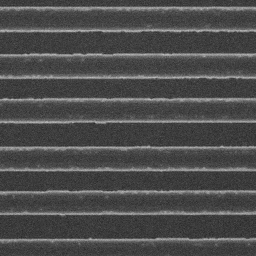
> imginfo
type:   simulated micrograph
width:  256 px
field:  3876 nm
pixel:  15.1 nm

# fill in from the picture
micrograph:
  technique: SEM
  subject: lines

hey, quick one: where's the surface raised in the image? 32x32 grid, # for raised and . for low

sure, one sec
................................
################################
################################
################################
................................
................................
................................
################################
################################
################################
................................
................................
################################
################################
################################
................................
................................
................................
.#..##.#########################
################################
################################
................................
................................
................................
################################
################################
################################
................................
................................
................................
################################
################################